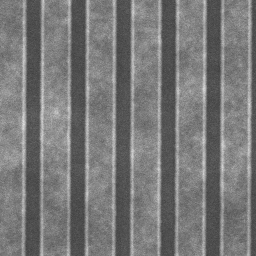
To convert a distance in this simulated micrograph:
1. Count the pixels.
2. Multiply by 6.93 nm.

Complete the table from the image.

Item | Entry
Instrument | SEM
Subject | parallel lines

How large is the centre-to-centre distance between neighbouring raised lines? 45.1 pixels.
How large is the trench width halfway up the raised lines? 118 nm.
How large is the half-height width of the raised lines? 193 nm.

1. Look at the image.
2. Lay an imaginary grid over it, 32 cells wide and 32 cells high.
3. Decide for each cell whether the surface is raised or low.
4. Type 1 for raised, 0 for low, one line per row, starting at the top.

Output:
11100111100111000111001111001110
11100111100111000111001111001110
11100111100111000111001111001110
11100111100111000111001111001110
11100111100111000111001111001110
11100111100111000111001111001110
11100111100111000111001111001110
11100111100111000111001111001110
11100111100111000111001111001110
11100111100111000111001111001110
11100111100111000111001111001110
11100111100111001111001111001110
11100111100111001111001111001110
11100111100111001111001111001110
11100111100111001111001111001110
11100111100111001111001111001110
11100111100111001111001111001110
11100111100111001111001111001110
11100111100111001111001111001110
11100111100111001111001111001110
11100111100111001111001111001110
11100111100111001111001111001110
11100111100111001111001111001110
11100111100111000111001111001110
11100111100111001111001111001110
11100111100111001111001111001110
11100111100111001111001111001110
11100111100111001111001111001110
11100111100111001111001111001110
11100111100111001111001111001110
11100111100111001111001111001110
11100111100111001111001111001110